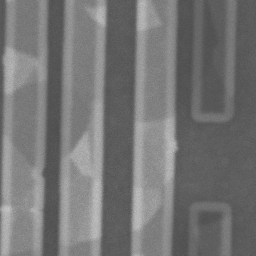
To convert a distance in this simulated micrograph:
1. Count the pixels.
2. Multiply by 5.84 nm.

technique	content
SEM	one or a few lines or trenches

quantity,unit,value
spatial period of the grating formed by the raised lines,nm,370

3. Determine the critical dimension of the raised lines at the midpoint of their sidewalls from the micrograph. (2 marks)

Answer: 0.198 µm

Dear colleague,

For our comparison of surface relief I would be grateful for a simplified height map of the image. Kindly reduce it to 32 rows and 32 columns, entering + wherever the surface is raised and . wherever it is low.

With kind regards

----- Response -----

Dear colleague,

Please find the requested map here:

.++++....++++.....++++...++++...
.++++....++++.....++++...++++...
.++++....++++.....++++...++++...
.++++....++++.....++++...++++...
.++++...+++++.....+++....++++...
.++++...+++++.....+++....++++...
.++++...+++++.....+++....++++...
.++++...+++++.....+++....++++...
.++++...+++++.....+++....++++...
.++++...+++++.....+++....++++...
.++++...++++......+++....++++...
.++++...++++......+++....++++...
.++++...++++.....++++....++++...
.++++...++++.....++++...+++++...
.++++...++++.....++++....+++....
.++++...++++.....++++...........
.++++...++++.....++++...........
.++++...++++.....++++...........
.++++...++++.....+++++..........
.++++...++++.....++++...........
.++++...++++.....++++...........
.++++...++++.....++++...........
.++++...++++.....++++...........
.++++...++++.....++++...........
.++++...++++.....++++...........
.++++...++++.....++++...........
.++++...++++.....++++...++++....
.++++...++++.....++++...++++....
.++++...++++.....++++...++++....
.++++...++++.....++++...++++....
.++++...++++.....++++...++++....
.++++...++++.....++++...++++....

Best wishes